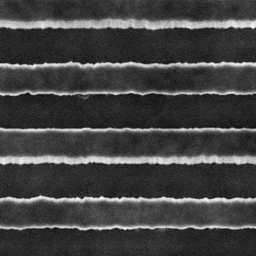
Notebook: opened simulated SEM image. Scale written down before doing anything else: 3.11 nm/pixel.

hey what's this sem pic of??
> lines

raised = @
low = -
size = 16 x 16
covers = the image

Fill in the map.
@@@@@@@@@@@@@@@@
@@@@@@@@@@@@@@@@
----------------
----------------
@@@@@@@@@@@@@@@@
@@@@@@@@@@@@@@@@
----------------
----------------
@@@@@@@@@@@@@@@@
@@@@@@@@@@@@@@@@
----------------
----------------
@@@@@@@@@@@@@@@@
@@@@@@@@@@@@@@@@
----------------
----------------